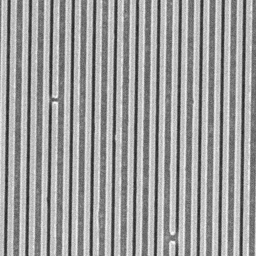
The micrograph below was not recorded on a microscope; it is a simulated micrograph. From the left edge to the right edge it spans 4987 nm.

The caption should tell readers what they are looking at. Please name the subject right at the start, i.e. parallel lines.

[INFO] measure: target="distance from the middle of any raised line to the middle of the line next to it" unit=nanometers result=208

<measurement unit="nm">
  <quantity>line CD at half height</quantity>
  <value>107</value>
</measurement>